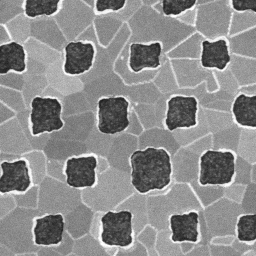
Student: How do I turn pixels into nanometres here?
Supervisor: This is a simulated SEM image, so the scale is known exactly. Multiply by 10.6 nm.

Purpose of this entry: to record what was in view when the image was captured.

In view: a regular array of holes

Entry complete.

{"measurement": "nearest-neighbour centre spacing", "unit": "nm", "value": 701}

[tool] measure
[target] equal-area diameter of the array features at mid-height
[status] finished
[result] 360 nm